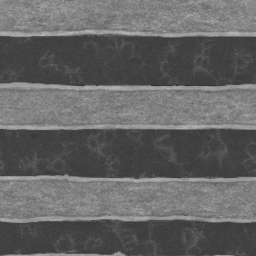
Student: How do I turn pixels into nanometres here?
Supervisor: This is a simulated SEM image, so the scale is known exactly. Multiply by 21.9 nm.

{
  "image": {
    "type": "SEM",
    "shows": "one or a few lines or trenches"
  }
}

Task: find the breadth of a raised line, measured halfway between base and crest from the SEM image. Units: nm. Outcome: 855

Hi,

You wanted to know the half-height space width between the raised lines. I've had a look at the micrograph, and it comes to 1.15 microns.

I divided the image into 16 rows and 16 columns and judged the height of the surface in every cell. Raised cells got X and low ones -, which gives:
XXXXXXXXXXXXXXXX
XXXXXXXXXXXXXXXX
----------------
----------------
----------------
XXXX-------XX-XX
XXXXXXXXXXXXXXXX
XXXXXXXXXXXXXXXX
----------------
----------------
----------------
XXXXXXXXXXXXXXXX
XXXXXXXXXXXXXXXX
XXXXXXXXXXXXXXXX
----------------
----------------